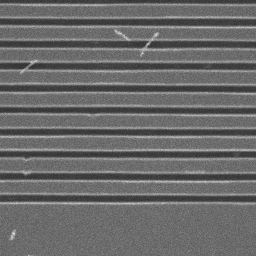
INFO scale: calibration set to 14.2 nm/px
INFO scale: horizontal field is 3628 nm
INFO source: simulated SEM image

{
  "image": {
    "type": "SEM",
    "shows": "parallel lines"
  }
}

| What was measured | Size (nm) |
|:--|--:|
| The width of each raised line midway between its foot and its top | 214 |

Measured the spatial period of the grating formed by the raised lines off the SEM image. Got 313 nm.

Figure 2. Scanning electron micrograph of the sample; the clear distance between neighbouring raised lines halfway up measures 93.9 nm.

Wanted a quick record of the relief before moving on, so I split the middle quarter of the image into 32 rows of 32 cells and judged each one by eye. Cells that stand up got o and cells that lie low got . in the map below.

................................
................................
oooooooooooooooooooooooooooooooo
oooooooooooooooooooooooooooooooo
oooooooooooooooooooooooooooooooo
................................
................................
oooooooooooooooooooooooooooooooo
oooooooooooooooooooooooooooooooo
oooooooooooooooooooooooooooooooo
ooo...ooo.........oooooooooooooo
................................
ooooo....oooooo.................
oooooooooooooooooooooooooooooooo
oooooooooooooooooooooooooooooooo
oooooooooooooooooooooooooooooooo
................................
................................
oooooooooooooooooooooooooooooooo
oooooooooooooooooooooooooooooooo
oooooooooooooooooooooooooooooooo
oooooooooooooooooooooooooooooooo
................................
o...............................
oooooooooooooooooooooooooooooooo
oooooooooooooooooooooooooooooooo
oooooooooooooooooooooooooooooooo
................................
................................
oooooooooooooooooooooooooooooooo
oooooooooooooooooooooooooooooooo
oooooooooooooooooooooooooooooooo